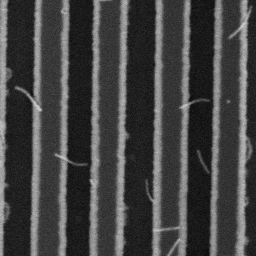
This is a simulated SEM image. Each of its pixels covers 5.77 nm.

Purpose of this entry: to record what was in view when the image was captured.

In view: lines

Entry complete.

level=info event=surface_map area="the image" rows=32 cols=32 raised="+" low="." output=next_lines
+....+++....++++....++++...++++.
+....+++....++++....++++...++++.
+....+++....++++....++++...++++.
+....+++....++++....++++...++++.
+...++++....++++....++++...++++.
+...++++....++++....++++...++++.
+...++++....++++....++++...++++.
....++++....++++....++++...++++.
....++++....++++....++++...++++.
+...++++....+++.....+++....++++.
....++++....+++.....+++....++++.
....++++....+++.....+++....++++.
....++++....++++....+++....++++.
....++++....+++.....+++....++++.
....++++....+++.....+++....++++.
....++++....+++.....+++....++++.
....++++....+++.....+++....++++.
....++++....+++.....+++....++++.
+...++++....+++.....+++....++++.
....++++....+++.....+++....++++.
....++++....+++....++++....++++.
....++++....+++....++++....++++.
....++++...++++....++++....+++..
....++++....+++....++++....+++..
....++++....+++....++++....+++..
....++++...++++....++++....+++..
....++++...++++....++++....+++..
....++++...++++....++++....+++..
....++++...++++....++++....+++..
....++++...++++....++++....+++..
....++++...++++....++++....+++..
....++++...++++....++++...++++..